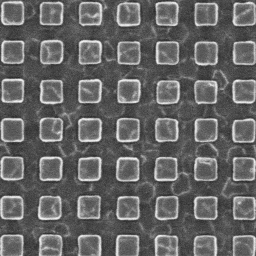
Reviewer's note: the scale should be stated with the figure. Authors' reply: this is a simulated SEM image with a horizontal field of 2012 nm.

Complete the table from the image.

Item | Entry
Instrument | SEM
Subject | a regular array of raised bodies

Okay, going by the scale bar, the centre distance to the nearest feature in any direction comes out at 301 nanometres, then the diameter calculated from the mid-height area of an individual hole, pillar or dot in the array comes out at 194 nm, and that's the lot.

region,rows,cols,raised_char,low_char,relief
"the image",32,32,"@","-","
@@@--@@@--@@---@@---@@---@@---@@
@@@--@@@--@@@--@@---@@--@@@--@@@
@@@--@@@--@@@--@@@--@@--@@@--@@@
--------------------------------
--------------------------------
@@@--@@@--@@---@@---@@---@@--@@@
@@@--@@@--@@@--@@---@@--@@@--@@@
@@@--@@@--@@@--@@---@@--@@@--@@@
--------------------------------
--------------------------------
@@@--@@@--@@@--@@---@@---@@--@@@
@@@--@@@--@@---@@---@@--@@@--@@@
@@@--@@@--@@---@@---@@---@@--@@@
--------------------------------
--------------------------------
@@@--@@@--@@@--@@---@@--@@@--@@@
@@@--@@@--@@@--@@---@@--@@@--@@@
-@@--@@---@@---@@---@@---@@--@@@
--------------------------------
--------------------------------
@@@--@@@--@@@--@@---@@--@@@--@@@
@@@--@@@--@@---@@---@@--@@@--@@@
-----@@---@@---@@---@----@@-----
--------------------------------
----------@@--------------------
@@@--@@@--@@@--@@---@@--@@@--@@@
@@@--@@@--@@---@@---@@--@@@--@@@
--------------------------------
--------------------------------
-@@--@@---@@---@@---@-----------
@@@--@@@--@@@--@@--@@@--@@@--@@@
@@@--@@@--@@@--@@--@@@--@@@--@@@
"